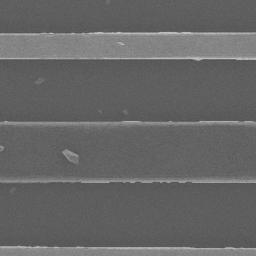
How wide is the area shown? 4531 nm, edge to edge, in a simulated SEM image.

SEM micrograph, lines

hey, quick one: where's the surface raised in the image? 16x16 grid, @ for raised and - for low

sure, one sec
----------------
----------------
@@@@@@@@@@@@@@@@
@@@@@@@@@@@@@@@@
----------------
----------------
----------------
----------------
@@@@@@@@@@@@@@@@
@@@@@@@@@@@@@@@@
@@@@@@@@@@@@@@@@
----------------
----------------
----------------
----------------
@@@@@@@@@@@@@-@@